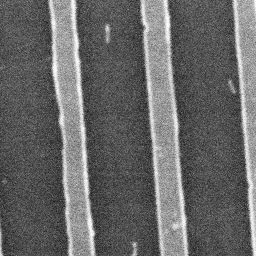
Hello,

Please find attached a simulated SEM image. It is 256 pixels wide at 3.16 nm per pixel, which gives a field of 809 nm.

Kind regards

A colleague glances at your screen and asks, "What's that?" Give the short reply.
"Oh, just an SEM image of one or a few lines or trenches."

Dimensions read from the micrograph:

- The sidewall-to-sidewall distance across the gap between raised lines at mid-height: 215 nanometres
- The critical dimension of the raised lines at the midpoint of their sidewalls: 0.0756 µm